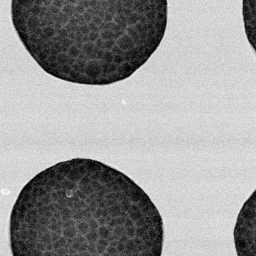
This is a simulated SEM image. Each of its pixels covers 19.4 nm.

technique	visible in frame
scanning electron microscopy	holes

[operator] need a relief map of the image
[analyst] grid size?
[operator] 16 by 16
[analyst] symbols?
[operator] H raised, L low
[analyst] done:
HLLLLLLLLLHHHHHL
HLLLLLLLLLHHHHHL
HLLLLLLLLLHHHHHL
HHLLLLLLLHHHHHHH
HHHLLLLLHHHHHHHH
HHHHHHHHHHHHHHHH
HHHHHHHHHHHHHHHH
HHHHHHHHHHHHHHHH
HHHHHHHHHHHHHHHH
HHHHHHHHHHHHHHHH
HHHLLLLHHHHHHHHH
HHLLLLLLLHHHHHHH
HLLLLLLLLHHHHHHL
HLLLLLLLLLHHHHHL
HLLLLLLLLLHHHHHL
HLLLLLLLLLHHHHHL